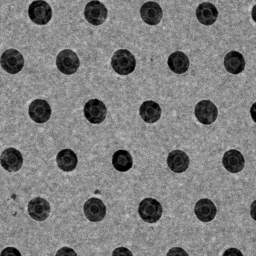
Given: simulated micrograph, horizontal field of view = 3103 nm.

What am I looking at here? a regular array of ring-shaped grooves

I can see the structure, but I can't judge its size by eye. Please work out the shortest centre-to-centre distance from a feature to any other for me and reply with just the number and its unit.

671 nm